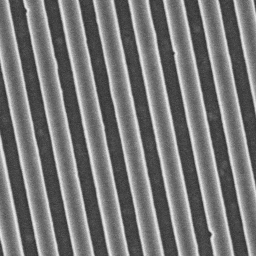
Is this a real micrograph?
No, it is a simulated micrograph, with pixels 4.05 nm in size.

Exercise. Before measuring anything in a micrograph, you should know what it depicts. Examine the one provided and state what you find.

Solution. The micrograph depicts parallel lines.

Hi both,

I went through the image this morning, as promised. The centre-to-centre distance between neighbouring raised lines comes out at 139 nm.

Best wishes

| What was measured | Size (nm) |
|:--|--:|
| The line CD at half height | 75.5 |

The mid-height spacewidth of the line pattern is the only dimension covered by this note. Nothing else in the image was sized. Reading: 64.5 nm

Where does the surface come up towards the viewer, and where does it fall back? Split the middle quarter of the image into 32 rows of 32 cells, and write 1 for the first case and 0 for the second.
00111110000111100000111100001111
00111110000111110000111100001111
00011110000111110000111110000111
00011110000111110000111110000111
00011111000011110000111110000111
00011111000011110000011110000111
00011111000011111000011110000111
00001111000011111000011111000011
00001111000011111000011111000011
00001111100011111000011111000011
00001111100001111000011111000011
00001111100001111100001111000011
00001111100001111100001111100001
10000111100001111100001111100001
10000111110000111100001111100001
10000111110000111100001111100001
10000111110000111110000111100001
10000111110000111110000111110000
11000011110000111110000111110000
11000011111000011110000111110000
11000011111000011110000111110000
11000011111000011111000011110000
11000011111000011111000011110000
11100001111000011111000011111000
11100001111100001111000011111000
11100001111100001111000001111000
11100001111100001111100001111000
11100001111100001111100001111100
11100000111100001111100001111100
11110000111110001111100001111100
11110000111110000111100000111100
11110000111110000111110001111100